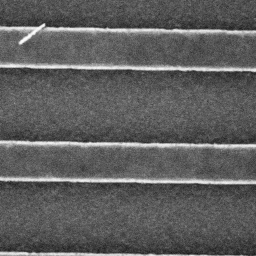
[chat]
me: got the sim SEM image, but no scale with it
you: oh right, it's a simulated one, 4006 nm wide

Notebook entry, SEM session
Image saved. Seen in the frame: lines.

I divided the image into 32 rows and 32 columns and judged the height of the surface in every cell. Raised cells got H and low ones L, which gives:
LLLLLLLLLLLLLLLLLLLLLLLLLLLLLLLL
LLLLLLLLLLLLLLLLLLLLLLLLLLLLLLLL
LLLLLLLLLLLLLLLLLLLLLLLLLLLLLLLL
HHHHHHLLLLLLLLLLLLLLLLLLLLLLLLLL
HHHHHHHHHHHHHHHHHHHHHHHHHHHHHHHH
HHHHHHHHHHHHHHHHHHHHHHHHHHHHHHHH
HHHHHHHHHHHHHHHHHHHHHHHHHHHHHHHH
HHHHHHHHHHHHHHHHHHHHHHHHHHHHHHHH
LLLLLLLLLLHHHHHHHHHHHHHHHHHHHHHH
LLLLLLLLLLLLLLLLLLLLLLLLLLLLLLLL
LLLLLLLLLLLLLLLLLLLLLLLLLLLLLLLL
LLLLLLLLLLLLLLLLLLLLLLLLLLLLLLLL
LLLLLLLLLLLLLLLLLLLLLLLLLLLLLLLL
LLLLLLLLLLLLLLLLLLLLLLLLLLLLLLLL
LLLLLLLLLLLLLLLLLLLLLLLLLLLLLLLL
LLLLLLLLLLLLLLLLLLLLLLLLLLLLLLLL
LLLLLLLLLLLLLLLLLLLLLLLLLLLLLLLL
LLLLLLLLLLLLLLLLLLLLLLLLLLLLLLLL
HHHHHHHHHHHHHHHHHHHHHHHHHHHHHHHH
HHHHHHHHHHHHHHHHHHHHHHHHHHHHHHHH
HHHHHHHHHHHHHHHHHHHHHHHHHHHHHHHH
HHHHHHHHHHHHHHHHHHHHHHHHHHHHHHHH
LLLHHHHHHHHHHHHHHHHHHHHHHHHHHHHH
LLLLLLLLLLLLLLLLLLLLLLLLLLLLLLLL
LLLLLLLLLLLLLLLLLLLLLLLLLLLLLLLL
LLLLLLLLLLLLLLLLLLLLLLLLLLLLLLLL
LLLLLLLLLLLLLLLLLLLLLLLLLLLLLLLL
LLLLLLLLLLLLLLLLLLLLLLLLLLLLLLLL
LLLLLLLLLLLLLLLLLLLLLLLLLLLLLLLL
LLLLLLLLLLLLLLLLLLLLLLLLLLLLLLLL
LLLLLLLLLLLLLLLLLLLLLLLLLLLLLLLL
LLLLLLLLLLLLLLLLLLLLLLLLLLLLLLLL